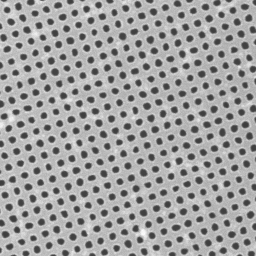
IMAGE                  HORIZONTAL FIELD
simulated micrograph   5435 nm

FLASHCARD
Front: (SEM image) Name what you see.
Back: a regular array of holes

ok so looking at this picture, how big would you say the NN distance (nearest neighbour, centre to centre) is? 257 nm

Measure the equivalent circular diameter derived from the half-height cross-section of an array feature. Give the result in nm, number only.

161